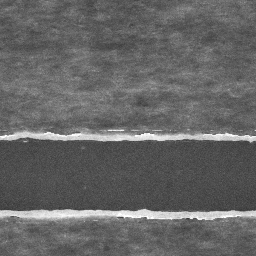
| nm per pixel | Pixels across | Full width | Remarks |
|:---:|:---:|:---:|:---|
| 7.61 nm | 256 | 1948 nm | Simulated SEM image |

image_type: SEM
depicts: one or a few lines or trenches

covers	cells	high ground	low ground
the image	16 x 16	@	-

@@@@@@@@@@@@@@@@
@@@@@@@@@@@@@@@@
@@@@@@@@@@@@@@@@
@@@@@@@@@@@@@@@@
@@@@@@@@@@@@@@@@
@@@@@@@@@@@@@@@@
@@@@@@@@@@@@@@@@
@@@@@@@@@@@@@@@@
@-@@@@@@@@@@@@@@
----------------
----------------
----------------
----------------
@@@@@@@@@@@@@@@@
@@@@@@@@@@@@@@@@
@@@@@@@@@@@@@@@@